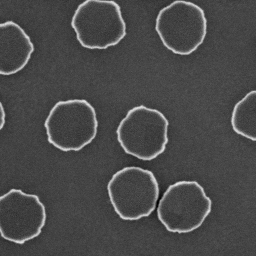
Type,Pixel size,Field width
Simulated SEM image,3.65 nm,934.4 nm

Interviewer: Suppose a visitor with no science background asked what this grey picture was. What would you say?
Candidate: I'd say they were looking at raised bodies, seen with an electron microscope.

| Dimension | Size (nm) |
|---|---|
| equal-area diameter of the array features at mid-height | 186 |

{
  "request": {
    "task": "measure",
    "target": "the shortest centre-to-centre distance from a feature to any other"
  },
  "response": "221 nm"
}